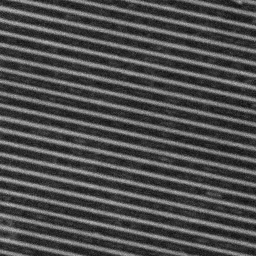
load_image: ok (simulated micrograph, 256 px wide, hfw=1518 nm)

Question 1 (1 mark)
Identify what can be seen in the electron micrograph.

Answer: parallel lines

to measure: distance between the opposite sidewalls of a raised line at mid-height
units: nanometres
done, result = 17.4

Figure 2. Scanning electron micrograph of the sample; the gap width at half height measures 52.9 nanometres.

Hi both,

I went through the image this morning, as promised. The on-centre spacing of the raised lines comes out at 70.5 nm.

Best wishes